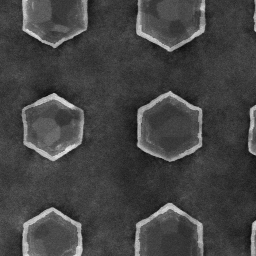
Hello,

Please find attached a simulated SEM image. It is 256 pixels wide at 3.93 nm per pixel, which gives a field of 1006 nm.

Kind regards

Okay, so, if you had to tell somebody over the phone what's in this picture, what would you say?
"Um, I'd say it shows raised bodies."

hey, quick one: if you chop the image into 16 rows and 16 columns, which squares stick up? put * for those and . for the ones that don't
..***....****...
.****....****...
..**.....***....
................
................
................
..**.....***....
.****....****...
..***....****...
..**.....***....
................
................
................
..**.....***....
.****....****...
.****...*****...